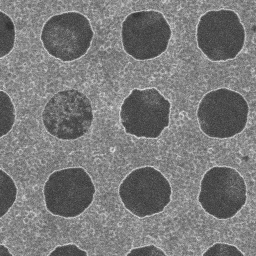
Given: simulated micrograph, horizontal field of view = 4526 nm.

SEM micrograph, a regular array of raised bodies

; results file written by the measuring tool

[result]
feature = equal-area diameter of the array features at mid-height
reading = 912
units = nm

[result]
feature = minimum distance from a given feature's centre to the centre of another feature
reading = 1.36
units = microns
